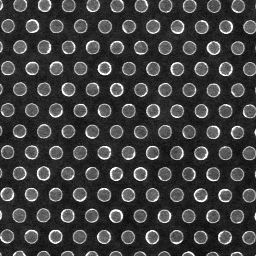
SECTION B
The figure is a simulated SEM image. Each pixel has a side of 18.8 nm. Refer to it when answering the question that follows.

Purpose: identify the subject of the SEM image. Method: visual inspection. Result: a regular array of raised bodies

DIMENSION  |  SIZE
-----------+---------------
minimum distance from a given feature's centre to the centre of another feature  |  453 nanometers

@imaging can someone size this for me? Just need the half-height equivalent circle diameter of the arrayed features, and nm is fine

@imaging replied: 248